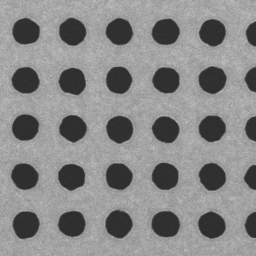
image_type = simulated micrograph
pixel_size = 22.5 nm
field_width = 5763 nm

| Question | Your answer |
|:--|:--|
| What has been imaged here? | a regular array of holes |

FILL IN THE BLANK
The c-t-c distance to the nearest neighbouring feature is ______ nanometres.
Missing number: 1050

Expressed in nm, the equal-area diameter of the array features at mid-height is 612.